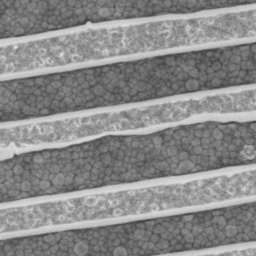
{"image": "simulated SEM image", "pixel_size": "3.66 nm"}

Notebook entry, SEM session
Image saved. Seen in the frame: one or a few lines or trenches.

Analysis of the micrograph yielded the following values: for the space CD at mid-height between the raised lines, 170 nm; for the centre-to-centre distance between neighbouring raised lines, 0.292 micrometres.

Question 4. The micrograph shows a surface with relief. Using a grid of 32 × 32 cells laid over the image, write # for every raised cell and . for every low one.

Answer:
................................
............................####
..................##############
..........######################
.....###########################
############################....
#####################...........
###############.................
########........................
###.............................
................................
..........................######
....................############
..............##################
........########################
.#####################..........
#################...............
###########.....................
#####...........................
................................
................................
............................####
....................############
...............#################
........########################
.############################...
#######################.........
################................
########........................
#...............................
...............................#
.........................#######